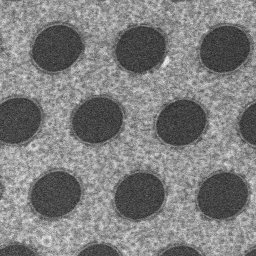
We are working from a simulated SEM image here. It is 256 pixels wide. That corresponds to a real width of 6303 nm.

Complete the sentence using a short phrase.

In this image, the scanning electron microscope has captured a regular array of raised bodies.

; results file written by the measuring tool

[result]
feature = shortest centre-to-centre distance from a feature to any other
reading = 2050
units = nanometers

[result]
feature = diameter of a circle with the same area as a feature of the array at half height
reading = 1.23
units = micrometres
